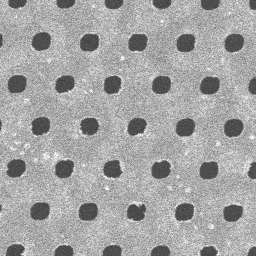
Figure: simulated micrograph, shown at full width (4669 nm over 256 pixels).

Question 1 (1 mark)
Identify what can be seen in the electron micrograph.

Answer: a regular array of holes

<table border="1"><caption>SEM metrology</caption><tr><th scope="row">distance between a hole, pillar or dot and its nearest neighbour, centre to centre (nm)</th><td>876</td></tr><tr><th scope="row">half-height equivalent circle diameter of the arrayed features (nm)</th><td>355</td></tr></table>